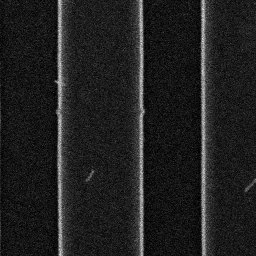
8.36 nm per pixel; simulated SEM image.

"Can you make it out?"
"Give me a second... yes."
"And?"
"one or a few lines or trenches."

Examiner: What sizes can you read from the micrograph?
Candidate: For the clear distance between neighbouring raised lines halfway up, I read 514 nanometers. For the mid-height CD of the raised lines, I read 684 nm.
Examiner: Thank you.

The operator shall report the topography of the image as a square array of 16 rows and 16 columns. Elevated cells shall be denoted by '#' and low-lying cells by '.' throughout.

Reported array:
....#####....###
....#####....###
....#####....###
....#####....###
....#####....###
....#####....###
....#####....###
....#####....###
....#####....###
....#####....###
....#####....###
....#####....###
....#####....###
....#####....###
....#####....###
....#####....###